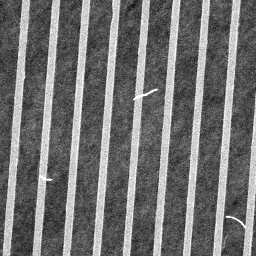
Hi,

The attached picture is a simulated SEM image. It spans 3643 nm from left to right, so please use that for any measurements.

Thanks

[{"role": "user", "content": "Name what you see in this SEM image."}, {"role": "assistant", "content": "parallel lines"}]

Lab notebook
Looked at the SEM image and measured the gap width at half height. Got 328 nm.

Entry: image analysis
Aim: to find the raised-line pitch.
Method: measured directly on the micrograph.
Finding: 427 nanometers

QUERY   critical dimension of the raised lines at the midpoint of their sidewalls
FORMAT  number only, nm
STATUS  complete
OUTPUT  97.5